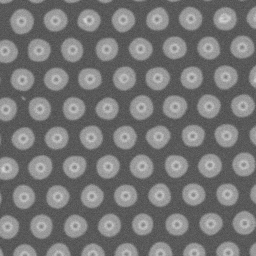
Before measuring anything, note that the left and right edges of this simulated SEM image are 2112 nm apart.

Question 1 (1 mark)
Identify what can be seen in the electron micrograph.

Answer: an array of small figures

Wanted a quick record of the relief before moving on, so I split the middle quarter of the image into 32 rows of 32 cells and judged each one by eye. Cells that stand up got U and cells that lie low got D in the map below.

DDDDDDDDDDDDDDDDDDDDDDDDDDDDDDDD
DDDDDUUUDDDDDUUUUDDDDUUUUDDDDDUU
UDDDUUUUUDDDDUUUUUDDDUUUUUDDDUUU
UDDDUUUUUDDDUUUUUUDDUUUUUUDDDUUU
UDDDUUUUUDDDUUUUUUDDDUUUUUDDDUUU
DDDDUUUUUDDDDUUUUDDDDUUUUUDDDDUU
DDDDDDDDDDDDDDUUDDDDDDDDDDDDDDDD
DDDDDDDDDDDDDDDDDDDDDDDDDDDDDDDD
DUUDDDDDDDUUDDDDDDUUUDDDDDUUUUDD
UUUUUDDDDUUUUDDDDUUUUUDDDUUUUUDD
UUUUUDDDUUUUUDDDDUUUUUDDDUUUUUUD
UUUUUDDDUUUUUDDDDUUUUUDDDUUUUUDD
UUUUUDDDUUUUUDDDDUUUUUDDDUUUUUDD
DUUUDDDDDUUUDDDDDDUUUDDDDDDUUDDD
DDDDDDDDDDDDDDDDDDDDDDDDDDDDDDDD
DDDDDDDDDDDDDDDDDDDDDDDDDDDDDDDU
DDDDDUUUUDDDDUUUUDDDDUUUUUDDDDUU
UDDDUUUUUDDDUUUUUUDDDUUUUUDDDDUU
UDDDUUUUUDDDUUUUUUDDDUUUUUDDDDUU
UDDDUUUUUDDDDUUUUUDDDUUUUUDDDDUU
DDDDDUUUUDDDDUUUUDDDDDUUUDDDDDDU
DDDDDDDDDDDDDDDDDDDDDDDDDDDDDDDD
DDDDDDDDDDDDDDDDDDDDDDDDDDDDDDDD
DUUUUDDDDUUUUDDDDDUUUDDDDDUUUUDD
UUUUUDDDUUUUUUDDDUUUUUDDDUUUUUUD
UUUUUDDDUUUUUUDDDUUUUUDDDUUUUUUD
UUUUUDDDUUUUUUDDDUUUUUDDDUUUUUUD
UUUUDDDDDUUUUDDDDUUUUUDDDDUUUUDD
DDDDDDDDDDUDDDDDDDDDDDDDDDDDDDDD
DDDDDDDDDDDDDDDDDDDDDDDDDDDDDDDD
DDDDDDUUDDDDDDUUUDDDDDDUUUDDDDDU
UDDDDUUUUDDDDUUUUUDDDDUUUUDDDDUU